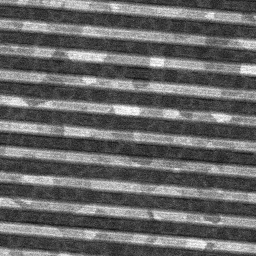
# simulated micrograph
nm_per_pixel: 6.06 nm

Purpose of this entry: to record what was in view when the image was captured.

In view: parallel lines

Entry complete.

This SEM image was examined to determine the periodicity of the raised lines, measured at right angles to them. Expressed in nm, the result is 154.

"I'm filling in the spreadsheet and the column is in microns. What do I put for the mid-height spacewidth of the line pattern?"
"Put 0.0892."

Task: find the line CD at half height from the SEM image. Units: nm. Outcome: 61.1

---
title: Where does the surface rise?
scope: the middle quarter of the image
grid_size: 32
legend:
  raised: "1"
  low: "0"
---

00000000000000000011011111111111
00000000000000000000000000000001
00000000000000000000000000000000
11111111000000000000000000000000
11111111111111111111000000000000
00001111111111111111111111111111
00000000000000001111111111111111
00000000000000000000000000001111
00000000000000000000000000000000
11111000000000000000000000000000
11111111111111111000000000000000
11111111111111111111111111111000
00000000001111111111111111111111
00000000000000000000001111111111
00000000000000000000000000000000
00000000000000000000000000000000
11111111111100000000000000000000
11111111111111111111111100000000
00000000111111111111111111111111
00000000000000000111111111111111
00000000000000000000000000000111
00000000000000000000000000000000
11111110000000000000000000000000
11111111111111111110000000000000
00111111111111111111111111111100
00000000000000111111111111111111
00000000000000000000000000111111
00000000000000000000000000000000
11110000000000000000000000000000
11111111111111110000000000000000
11111111111111111111111111110000
00000000011111111111111111111111